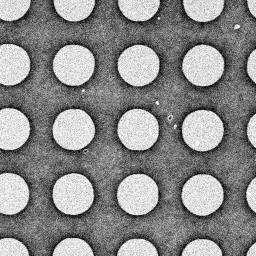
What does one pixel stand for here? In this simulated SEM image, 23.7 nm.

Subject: an array of small figures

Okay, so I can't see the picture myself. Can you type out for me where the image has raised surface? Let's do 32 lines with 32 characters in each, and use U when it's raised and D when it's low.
UUUUDDDUUUUUDDDUUUUUDDDUUUUUDDDU
UUUDDDDUUUUDDDDUUUUDDDDUUUUUDDDU
DUDDDDDDUUDDDDDDUUDDDDDDUUDDDDDD
DDDDDDDDDDDDDDDDDDDDDDDDDDDDDDDD
DDDDDDDDDDDDDDDDDDDDDDDDDDDDDDDD
DDDDDDDDDDDDDDDDDDDDDDDDDDDDDDDD
UUUDDDDUUUUDDDDUUUUDDDDDUUUDDDDD
UUUUDDDUUUUUDDDUUUUUDDDUUUUUDDDU
UUUUDDDUUUUUDDDUUUUUDDDUUUUUDDDU
UUUDDDDUUUUDDDDUUUUUDDDUUUUUDDDU
UUDDDDDDUUDDDDDDUUDDDDDDUUDDDDDD
DDDDDDDDDDDDDDDDDDDDDDDDDDDDDDDD
DDDDDDDDDDDDDDDDDDDDDDDDDDDDDDDD
DDDDDDDDDDDDDDDDDDDDDDDDDDDDDDDD
UUUDDDDUUUUDDDDUUUUDDDDDUUUDDDDD
UUUUDDDUUUUUDDDUUUUUDDDUUUUUDDDU
UUUUDDDUUUUUDDDUUUUUDDDUUUUUDDDU
UUUDDDDUUUUDDDDUUUUUDDDUUUUUDDDU
UUDDDDDDUUDDDDDDUUUDDDDDUUUDDDDD
DDDDDDDDDDDDDDDDDDDDDDDDDDDDDDDD
DDDDDDDDDDDDDDDDDDDDDDDDDDDDDDDD
DDDDDDDDDDDDDDDDDDDDDDDDDDDDDDDD
UUUDDDDUUUUDDDDUUUUDDDDDUUUDDDDD
UUUDDDDUUUUUDDDUUUUUDDDUUUUUDDDU
UUUUDDDUUUUUDDDUUUUUDDDUUUUUDDDU
UUUDDDDUUUUDDDDUUUUUDDDUUUUUDDDU
UUDDDDDDUUDDDDDDUUUDDDDDUUUDDDDD
DDDDDDDDDDDDDDDDDDDDDDDDDDDDDDDD
DDDDDDDDDDDDDDDDDDDDDDDDDDDDDDDD
DDDDDDDDDDDDDDDDDDDDDDDDDDDDDDDD
UUUDDDDUUUUDDDDDUUUDDDDDUUUDDDDD
UUUDDDDUUUUUDDDUUUUUDDDUUUUUDDDU